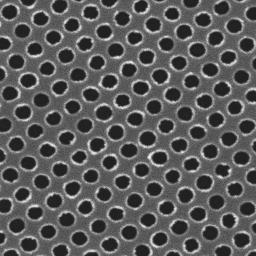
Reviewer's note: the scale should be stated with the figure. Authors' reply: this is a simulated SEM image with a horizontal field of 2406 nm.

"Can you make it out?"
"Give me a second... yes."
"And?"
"a regular array of holes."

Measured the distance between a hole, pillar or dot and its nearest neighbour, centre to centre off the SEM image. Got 208 nm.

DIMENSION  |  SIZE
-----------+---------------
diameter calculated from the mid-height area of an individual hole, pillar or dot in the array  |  0.134 microns